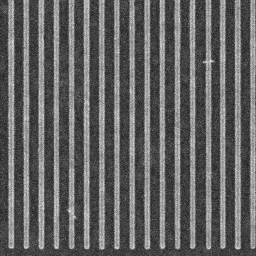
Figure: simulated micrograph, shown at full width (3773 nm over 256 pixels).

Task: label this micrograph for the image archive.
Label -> parallel lines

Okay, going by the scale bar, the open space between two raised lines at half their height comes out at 10.5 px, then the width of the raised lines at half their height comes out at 62.7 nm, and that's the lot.